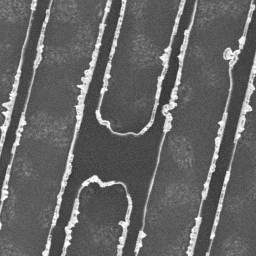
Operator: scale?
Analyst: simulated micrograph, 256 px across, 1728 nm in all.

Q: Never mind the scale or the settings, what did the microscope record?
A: one or a few lines or trenches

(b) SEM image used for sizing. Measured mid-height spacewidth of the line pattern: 346 nm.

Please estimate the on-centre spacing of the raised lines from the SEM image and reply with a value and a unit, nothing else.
0.473 microns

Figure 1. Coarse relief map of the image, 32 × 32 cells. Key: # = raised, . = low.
....##.......###.......##......#
....##.......###......##.......#
....##.......##.......##.......#
....##......###.......##.......#
...##.......###......###......##
...##.......###......##.......##
...##.......##.......##.....####
...##......###......###.....####
..###......###......###......###
..##......####......###......###
..##......###.......##.......###
.###......###.......##.......###
.###......###......###.......##.
.##.......##.......###......###.
.##.......###......##.......###.
###.......####....###......####.
###......#####...####......###..
##.......###########.......###..
##.......###########.......##...
##.......###########.......##...
#.......############......###...
#.......###########.......###...
#.......###########.......###...
#.......##......###......###....
#......###......###......###....
.......###......##.......###....
.......###......##.......###....
.......###......##.......##.....
......###......###......###.....
......###......###......###.....
......###......###......##......
.....###.......##......###......